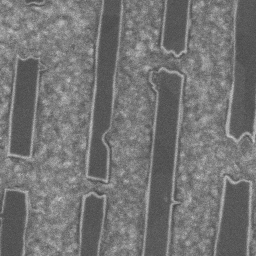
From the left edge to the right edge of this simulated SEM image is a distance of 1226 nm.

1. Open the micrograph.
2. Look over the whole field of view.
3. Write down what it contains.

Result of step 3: one or a few lines or trenches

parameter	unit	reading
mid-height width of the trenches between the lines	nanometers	238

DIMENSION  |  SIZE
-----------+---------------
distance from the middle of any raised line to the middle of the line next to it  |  336 nanometers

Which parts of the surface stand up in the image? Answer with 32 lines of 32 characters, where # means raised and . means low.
.............##......###......##
.............##......###.....###
.............##......##......###
............###.....###......###
............###.....###......###
............###.....###......###
............###......##......###
..###.......###..............###
..####......###..............###
..###.......##.....####......###
..###.......##.....####......###
..###.......##......###......###
..###.......##......###......###
.####.......##......##.......###
.###.......###.....###.......###
.###.......###.....###......####
.###.......##......###......####
.###.......##......###..........
.###.......##......###..........
..##.......###.....###..........
...........##......###..........
...........##......###..........
...................###......#...
...................###......###.
.##........##......###......###.
###.......###.....####......###.
####......###.....###.......###.
###.......###.....###.......###.
###.......###.....###......####.
###.......###.....###......####.
###.......##......###......####.
###.......##......###......####.